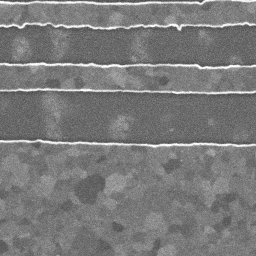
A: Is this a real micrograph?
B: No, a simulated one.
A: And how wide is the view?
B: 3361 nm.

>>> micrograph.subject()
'one or a few lines or trenches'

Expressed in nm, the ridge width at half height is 336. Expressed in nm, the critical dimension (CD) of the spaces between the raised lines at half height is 615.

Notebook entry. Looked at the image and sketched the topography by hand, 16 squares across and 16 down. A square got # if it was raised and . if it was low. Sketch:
################
################
................
................
################
################
................
................
................
################
################
################
################
################
################
################